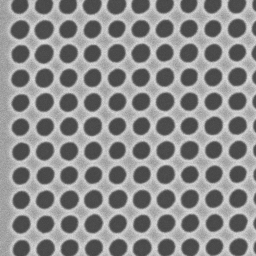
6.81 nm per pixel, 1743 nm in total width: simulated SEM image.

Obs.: a regular array of holes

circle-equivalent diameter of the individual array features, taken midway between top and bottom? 125 nanometers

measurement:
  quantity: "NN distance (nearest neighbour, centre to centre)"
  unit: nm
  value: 162